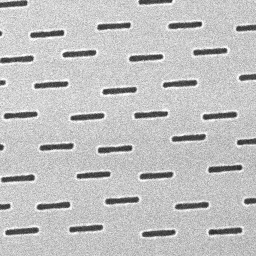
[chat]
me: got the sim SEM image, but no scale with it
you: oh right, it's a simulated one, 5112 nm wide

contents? a regular array of holes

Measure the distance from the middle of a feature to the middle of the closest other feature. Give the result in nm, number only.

811